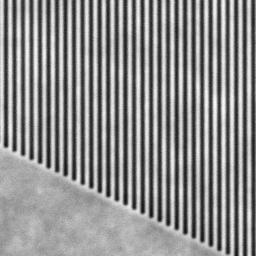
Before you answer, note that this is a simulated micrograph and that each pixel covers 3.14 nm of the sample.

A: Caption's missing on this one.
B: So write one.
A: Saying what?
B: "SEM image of parallel lines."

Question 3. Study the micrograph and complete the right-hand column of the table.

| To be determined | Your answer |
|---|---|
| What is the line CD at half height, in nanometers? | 11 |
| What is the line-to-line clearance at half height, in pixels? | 5.13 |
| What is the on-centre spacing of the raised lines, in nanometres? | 26.8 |